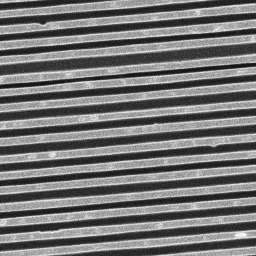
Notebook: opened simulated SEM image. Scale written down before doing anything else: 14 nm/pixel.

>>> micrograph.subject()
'parallel lines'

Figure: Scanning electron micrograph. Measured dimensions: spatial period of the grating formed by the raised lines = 225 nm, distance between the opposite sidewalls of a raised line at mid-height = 131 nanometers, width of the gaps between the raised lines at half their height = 0.0961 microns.